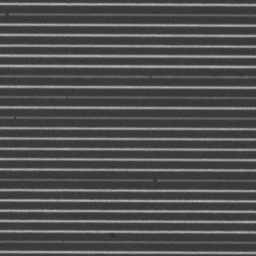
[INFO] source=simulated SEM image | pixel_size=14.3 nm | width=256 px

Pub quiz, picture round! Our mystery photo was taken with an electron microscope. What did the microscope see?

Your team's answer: parallel lines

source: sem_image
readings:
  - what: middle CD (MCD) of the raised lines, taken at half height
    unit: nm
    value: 23.2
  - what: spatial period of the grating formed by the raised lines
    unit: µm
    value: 0.147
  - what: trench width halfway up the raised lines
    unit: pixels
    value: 8.63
